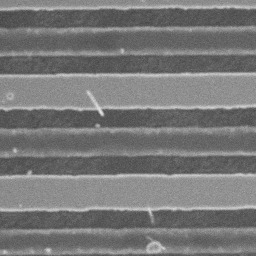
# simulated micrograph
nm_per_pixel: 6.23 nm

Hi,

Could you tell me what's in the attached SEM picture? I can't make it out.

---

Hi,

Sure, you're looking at lines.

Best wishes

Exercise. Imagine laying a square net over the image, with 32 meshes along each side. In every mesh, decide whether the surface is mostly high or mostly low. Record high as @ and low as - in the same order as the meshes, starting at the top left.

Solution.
@@@@@@@@@@@@@@@@@@@@@@@@@@@@@@@@
--------------------------------
--------------------------------
-------------------------------@
@@@@@@@@@@@@@@@@@@@@@@@@@@@@@@@@
@@@@@@@@@@@@@@@@@@@@@@@@@@@@@@@@
@@@@@@@@@@@@@@@@@@@-@@@@@@@@--@@
--------------------------------
--------------------------------
@@@@@@@@@@@@@@@@@@@@@@@@@@@@@@@@
@@@@@@@@@@@@@@@@@@@@@@@@@@@@@@@@
@@@@@@@@@@@@@@@@@@@@@@@@@@@@@@@@
@@@@@@@@@@@@@@@@@@@@@@@@@@@@@@@@
@@@@@@@@@@@@@@@@@@@@@@@@@@@-@---
--------------------------------
--------------------------------
@@@---@@@@@@@@@@@@@@@@@@@@@@@@@@
@@@@@@@@@@@@@@@@@@@@@@@@@@@@@@@@
@@@@@@@@@@@@@@@@@@@@@@@@@@@@@@@@
--------------------------------
--------------------------------
--------------------------------
@@@@@@@@@@@@@@@@@@@@@@@@@@@@@@@@
@@@@@@@@@@@@@@@@@@@@@@@@@@@@@@@@
@@@@@@@@@@@@@@@@@@@@@@@@@@@@@@@@
@@@@@@@@@@@@@@@@@@@@@@@@@@@@@@@@
--------------------------------
--------------------------------
--------------------------------
@@@@@@@@@@@@@@@@@@@@@@@@@@@@@@@@
@@@@@@@@@@@@@@@@@@@@@@@@@@@@@@@@
@@@----------@@---@@------------